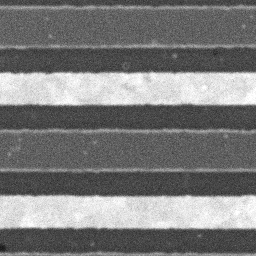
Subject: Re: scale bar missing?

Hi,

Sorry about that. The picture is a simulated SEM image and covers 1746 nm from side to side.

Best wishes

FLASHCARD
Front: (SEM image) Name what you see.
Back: lines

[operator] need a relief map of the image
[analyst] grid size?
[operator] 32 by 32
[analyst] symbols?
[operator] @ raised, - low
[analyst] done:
--------------------------------
@@@@@@@@@@@@@@@@@@@@@@@@@@@@@@@@
@@@@@@@@@@@@@@@@@@@@@@@@@@@@@@@@
@@@@@@@@@@@@@@@@@@@@@@@@@@@@@@@@
@@@@@@@@@@@@@@@@@@@@@@@@@@@@@@@@
@@@@@@@@@@@@@@@@@@@@@@@@@@@@@@@@
--------------------------------
--------------------------------
--------------------------------
@@@@@@@@@@@@@@@@@@@@@@@@@@@@@@@@
@@@@@@@@@@@@@@@@@@@@@@@@@@@@@@@@
@@@@@@@@@@@@@@@@@@@@@@@@@@@@@@@@
@@@@@@@@@@@@@@@@@@@@@@@@@@@@@@@@
--------------------------------
--------------------------------
--------------------------------
@@@@@@@@@@@@@@@@@@@@@@@@@@@@@@@@
@@@@@@@@@@@@@@@@@@@@@@@@@@@@@@@@
@@@@@@@@@@@@@@@@@@@@@@@@@@@@@@@@
@@@@@@@@@@@@@@@@@@@@@@@@@@@@@@@@
@@@@@@@@@@@@@@@@@@@@@@@@@@@@@@@@
--------------------------------
--------------------------------
--------------------------------
--------------------------------
@@@@@@@@@@@@@@@@@@@@@@@@@@@@@@@@
@@@@@@@@@@@@@@@@@@@@@@@@@@@@@@@@
@@@@@@@@@@@@@@@@@@@@@@@@@@@@@@@@
----------------------------@---
--------------------------------
--------------------------------
--------------------------------